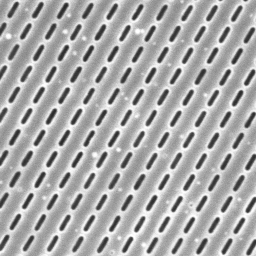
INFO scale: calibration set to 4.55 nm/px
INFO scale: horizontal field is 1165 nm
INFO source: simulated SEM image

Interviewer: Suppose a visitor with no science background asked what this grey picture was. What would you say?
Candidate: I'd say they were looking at a regular array of holes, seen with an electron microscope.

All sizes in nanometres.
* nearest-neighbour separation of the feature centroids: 109